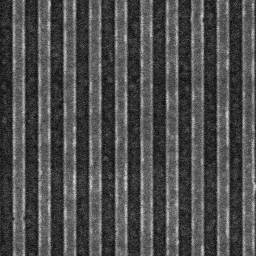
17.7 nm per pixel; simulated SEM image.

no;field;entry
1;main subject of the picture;parallel lines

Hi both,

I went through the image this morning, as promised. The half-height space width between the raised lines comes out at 268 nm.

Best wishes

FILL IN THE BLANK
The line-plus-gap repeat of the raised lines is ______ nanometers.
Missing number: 452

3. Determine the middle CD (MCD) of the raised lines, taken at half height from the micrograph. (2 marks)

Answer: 184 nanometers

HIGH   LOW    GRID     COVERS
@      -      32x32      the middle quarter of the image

@@@---@@@----@@----@@@----@@----
@@@---@@@----@@----@@@----@@----
@@@---@@@----@@----@@@----@@----
@@@---@@@----@@----@@@----@@----
@@@---@@@----@@----@@@----@@----
@@@---@@@----@@----@@@----@@----
@@@---@@@----@@----@@@----@@----
@@@---@@@----@@----@@@----@@----
@@@---@@@----@@@---@@@----@@----
@@@---@@@----@@@---@@@----@@----
@@@---@@@----@@@---@@@----@@----
@@@---@@@----@@----@@@----@@----
@@@---@@@----@@----@@@----@@----
@@@---@@@----@@----@@@----@@----
@@@---@@@----@@----@@@----@@----
@@@---@@@----@@----@@@----@@----
@@@---@@@----@@----@@@----@@----
@@@---@@@----@@----@@@----@@----
@@@---@@@----@@----@@@----@@----
@@@---@@@----@@----@@@----@@----
@@@---@@@----@@----@@@----@@----
@@@---@@@----@@----@@@----@@----
@@@---@@@----@@@---@@@----@@----
@@@---@@@----@@@---@@@----@@----
@@@---@@@----@@@---@@@----@@----
@@@---@@@----@@@---@@@----@@----
@@@---@@@----@@@---@@@----@@----
@@@----@@----@@@---@@@----@@----
@@@----@@----@@@---@@@----@@----
@@@----@@----@@@---@@@----@@----
@@@----@@----@@@---@@@----@@----
@@@----@@----@@@---@@@----@@----